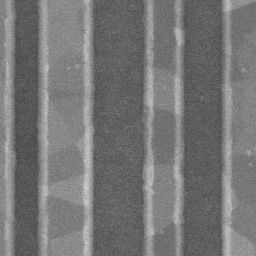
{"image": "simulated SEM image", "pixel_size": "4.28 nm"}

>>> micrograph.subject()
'one or a few lines or trenches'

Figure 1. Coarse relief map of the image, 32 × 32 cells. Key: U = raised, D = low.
UDDDDDUUUUUDDDDDDDDUUUDDDDDDDUUU
UDDDDDUUUUUDDDDDDDDUUUDDDDDDDUUU
UDDDDDUUUUUDDDDDDDDUUUDDDDDDUUUU
UDDDDDUUUUUDDDDDDDDUUUDDDDDDDUUU
UDDDDDUUUUUDDDDDDDDUUUDDDDDDUUUU
UDDDDDUUUUUDDDDDDDDUUUDDDDDDUUUU
UDDDDDUUUUUDDDDDDDUUUUDDDDDDUUUU
UDDDDDUUUUUDDDDDDDDUUUDDDDDDDUUU
UDDDDDUUUUUDDDDDDDDUUUDDDDDDDUUU
UDDDDDUUUUUDDDDDDDDUUUDDDDDDUUUU
UDDDDDUUUUUDDDDDDDDUUUDDDDDDUUUU
UDDDDDUUUUUDDDDDDDDUUUDDDDDDUUUU
UDDDDDUUUUUDDDDDDDDUUUDDDDDDUUUU
UDDDDDUUUUUDDDDDDDDUUUDDDDDDDUUU
UDDDDDUUUUUDDDDDDDDUUUDDDDDDDUUU
UDDDDDUUUUUDDDDDDDDUUUDDDDDDUUUU
UDDDDDUUUUUDDDDDDDDUUUDDDDDDDUUU
UDDDDDUUUUUDDDDDDDDUUUDDDDDDUUUU
UDDDDDUUUUUDDDDDDDDUUUDDDDDDUUUU
UDDDDDUUUUUDDDDDDDDUUUDDDDDDUUUU
UDDDDDUUUUUDDDDDDDDUUUDDDDDDUUUU
UDDDDDUUUUUDDDDDDDDUUUDDDDDDUUUU
UDDDDDUUUUUDDDDDDDDUUUDDDDDDUUUU
UDDDDDUUUUUDDDDDDDDUUUDDDDDDUUUU
UDDDDDUUUUUDDDDDDDDUUUDDDDDDDUUU
UDDDDDUUUUUDDDDDDDDUUUDDDDDDUUUU
UDDDDDUUUUUDDDDDDDDUUUDDDDDDUUUU
UDDDDDUUUUUDDDDDDDDUUUDDDDDDUUUU
UDDDDDUUUUUDDDDDDDDUUUDDDDDDDUUU
UDDDDDUUUUUDDDDDDDDUUUDDDDDDUUUU
UDDDDDUUUUUDDDDDDDDUUUDDDDDDDUUU
UDDDDDUUUUUDDDDDDDDUUUDDDDDDDUUU